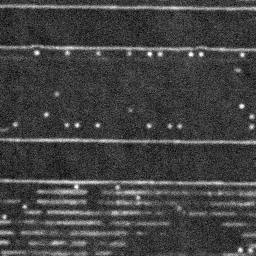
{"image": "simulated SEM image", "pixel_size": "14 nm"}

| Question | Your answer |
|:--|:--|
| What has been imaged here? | wiring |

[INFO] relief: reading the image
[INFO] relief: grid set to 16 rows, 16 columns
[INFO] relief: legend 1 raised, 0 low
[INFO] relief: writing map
0000000000011111
0000000000000000
0000000000000000
1111111111111111
1111111111111111
1111111111111111
1111111111111111
1111111111111111
1111111111111111
0000000000000000
0000000000000000
1111111111111111
1111111111111111
1111111111111111
1111111111111111
1111111111111111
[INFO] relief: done